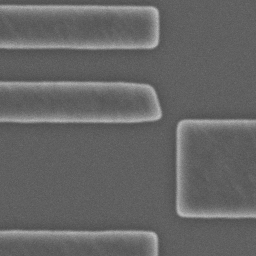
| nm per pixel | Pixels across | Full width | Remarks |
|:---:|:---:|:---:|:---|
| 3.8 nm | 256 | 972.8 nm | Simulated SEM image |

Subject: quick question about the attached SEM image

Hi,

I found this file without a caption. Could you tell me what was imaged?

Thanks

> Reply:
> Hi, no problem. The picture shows wiring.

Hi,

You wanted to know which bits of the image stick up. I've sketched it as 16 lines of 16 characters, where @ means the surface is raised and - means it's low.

@@@@@@@@@-------
@@@@@@@@@@------
@@@@@@@@@@------
----------------
----------------
@@@@@@@@@-------
@@@@@@@@@@------
@@@@@@@@@@------
-----------@@@@@
-----------@@@@@
-----------@@@@@
-----------@@@@@
-----------@@@@@
------------@@@@
@@@@@-@@@-------
@@@@@@@@@@------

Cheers